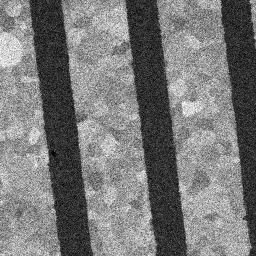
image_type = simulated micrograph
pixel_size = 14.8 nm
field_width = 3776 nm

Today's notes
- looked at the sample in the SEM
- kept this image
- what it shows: one or a few lines or trenches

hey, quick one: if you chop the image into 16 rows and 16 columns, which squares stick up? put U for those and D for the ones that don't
UUDDUUUUDDUUUUDD
UUDDUUUUDDUUUUDD
UUDDUUUUDDUUUUDD
UUDUUUUUDDUUUUDD
UUDDUUUUDDUUUUDD
UUDDDUUUDDDUUUDD
UUUDDUUUUDDUUUUD
UUUDDUUUUDDUUUUD
UUUDDUUUUDDUUUUD
UUUDDUUUUDDUUUUD
UUUDDUUUUDDUUUUD
UUUDDUUUUDDUUUUD
UUUDDUUUUDDUUUUD
UUUDDDUUUDDUUUUD
UUUUDDUUUUDDUUUU
UUUUDDUUUUDDUUUU